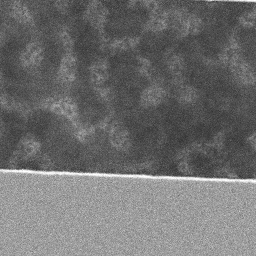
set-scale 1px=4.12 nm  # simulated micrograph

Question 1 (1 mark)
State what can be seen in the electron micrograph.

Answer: one or a few lines or trenches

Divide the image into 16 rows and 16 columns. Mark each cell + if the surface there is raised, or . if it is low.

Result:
................
................
................
................
................
................
................
................
................
................
................
++++++++++++++++
++++++++++++++++
++++++++++++++++
++++++++++++++++
++++++++++++++++